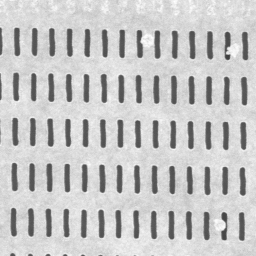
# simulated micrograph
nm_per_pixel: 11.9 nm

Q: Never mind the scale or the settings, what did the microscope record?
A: a regular array of holes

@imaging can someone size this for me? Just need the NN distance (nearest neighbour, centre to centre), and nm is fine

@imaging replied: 208